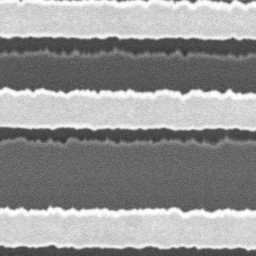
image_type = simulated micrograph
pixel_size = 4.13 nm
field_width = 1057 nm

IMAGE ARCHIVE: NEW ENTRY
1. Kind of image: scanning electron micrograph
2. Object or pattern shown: lines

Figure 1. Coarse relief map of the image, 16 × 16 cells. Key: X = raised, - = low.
XXXXXXXXXXXXXXXX
XXXXXXXXXXXXXXXX
----------------
----------------
----------------
----------------
XXXXXXXXXXXXXXXX
XXXXXXXXXXXXXXXX
----------------
----------------
----------------
----------------
----------------
XXXXXXXXXXXXXXXX
XXXXXXXXXXXXXXXX
-------X--X--XXX